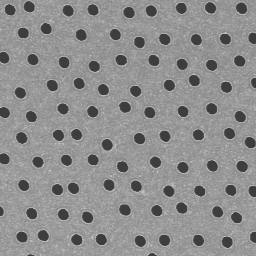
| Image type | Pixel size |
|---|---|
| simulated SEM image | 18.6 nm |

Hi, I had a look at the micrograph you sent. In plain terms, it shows a regular array of holes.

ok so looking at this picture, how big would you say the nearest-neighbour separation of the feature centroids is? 456 nm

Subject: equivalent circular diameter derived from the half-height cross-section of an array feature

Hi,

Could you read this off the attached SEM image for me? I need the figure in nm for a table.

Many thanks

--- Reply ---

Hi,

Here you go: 209